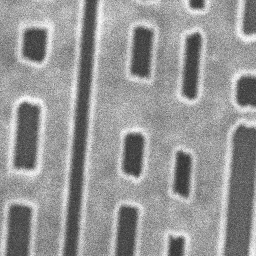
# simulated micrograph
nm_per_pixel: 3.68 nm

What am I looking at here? parallel lines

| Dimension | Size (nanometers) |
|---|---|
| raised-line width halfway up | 137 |